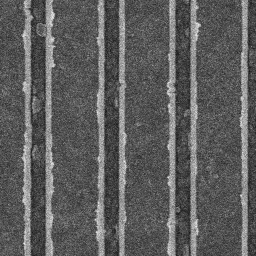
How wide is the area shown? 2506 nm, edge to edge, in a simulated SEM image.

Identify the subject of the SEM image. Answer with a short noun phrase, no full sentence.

one or a few lines or trenches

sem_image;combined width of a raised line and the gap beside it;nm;705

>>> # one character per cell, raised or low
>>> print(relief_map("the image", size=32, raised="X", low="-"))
XXX---XXXXXXX--XXXXXXX--XXXXXXX-
XXX---XXXXXXX--XXXXXXX--XXXXXXX-
XXXX--XXXXXXX--XXXXXXX--XXXXXXX-
XXX---XXXXXXX--XXXXXXX--XXXXXXX-
XXX---XXXXXXX--XXXXXXX--XXXXXXX-
XXX---XXXXXXX--XXXXXXX--XXXXXXX-
XXX---XXXXXXX--XXXXXXX--XXXXXXX-
XXX---XXXXXXX--XXXXXXX--XXXXXXX-
XXX---XXXXXXX--XXXXXXX--XXXXXXX-
XXX---XXXXXXX--XXXXXXX--XXXXXXX-
XXX---XXXXXXX--XXXXXXX--XXXXXXX-
XXX---XXXXXXX--XXXXXXX--XXXXXXX-
XXX---XXXXXXX--XXXXXXX--XXXXXXX-
XXX---XXXXXXX--XXXXXXX--XXXXXXX-
XXX---XXXXXXX--XXXXXXX--XXXXXXX-
XXXX--XXXXXXX--XXXXXXX--XXXXXXX-
XXXX--XXXXXXX--XXXXXXX--XXXXXXX-
XXXX--XXXXXXX--XXXXXXX--XXXXXXX-
XXXX--XXXXXXX--XXXXXXX--XXXXXXX-
XXX---XXXXXXX--XXXXXXX--XXXXXXX-
XXX---XXXXXXX--XXXXXXX--XXXXXXX-
XXX---XXXXXXX--XXXXXXX--XXXXXXX-
XXX---XXXXXXX--XXXXXXX--XXXXXXX-
XXX---XXXXXXX--XXXXXXX--XXXXXXX-
XXX---XXXXXXX--XXXXXXX--XXXXXXX-
XXX---XXXXXXX--XXXXXXX--XXXXXXX-
XXX---XXXXXXX--XXXXXXX--XXXXXXX-
XXX---XXXXXXX--XXXXXXX--XXXXXXX-
XXX---XXXXXXX--XXXXXXX--XXXXXXX-
XXX---XXXXXXX--XXXXXXX--XXXXXXX-
XXX---XXXXXXX--XXXXXXX--XXXXXXX-
XXX---XXXXXXX--XXXXXXX--XXXXXXX-